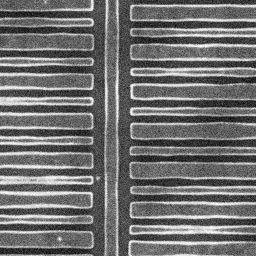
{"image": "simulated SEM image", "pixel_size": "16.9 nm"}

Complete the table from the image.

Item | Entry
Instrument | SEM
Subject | groups of lines, slits or small figures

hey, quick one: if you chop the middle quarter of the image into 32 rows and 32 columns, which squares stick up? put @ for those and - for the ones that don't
-----------@@-------------------
-----------@@----@@@@@@@@@@@@@@@
-----------@@----@@@@@@@@@@@@@@@
@@@@@@@----@@-------------------
@@@@@@@----@@-------------------
@@@@@@@----@@----@@@@@@@@@@@@@@@
-----------@@----@@@@@@@@@@@@@@@
-----------@@----@@@@@@@@@@@@@@@
-----------@@----@@@@@@@@@@@@@@@
@@@@@@@----@@-------------------
-----------@@-------------------
-----------@@----@@@@@@@@@@@@@@@
-----------@@----@@@@@@@@@@@@@@@
@@@@@@@----@@-------------------
@@@@@@@----@@-------------------
@@@@@@@----@@----@@@@@@@@@@@@@@@
-----------@@----@@@@@@@@@@@@@@@
-----------@@----@@@@@@@@@@@@@@@
@@@@@@@---@@@-----@@@@@@--@@@@@@
@@@@@@@---@@@-------------------
----------@@@-------------------
----------@@@----@@@@@@@@@@@@@@@
@@@@@@@---@@@----@@@@@@@@@@@@@@@
@@@@@@@---@@@-------------------
@@@@@@@---@@@-------------------
@@@@@@@---@@@----@@@@@@@@@@@@@@@
----------@@@----@@@@@@@@@@@@@@@
-----------@@----@@@@@@@@@@@@@@@
@@@@@@@----@@-----@@@@@--------@
@@@@@@@----@@-------------------
-----------@@-------------------
-----------@@----@@@@@@@@@@@@@@@